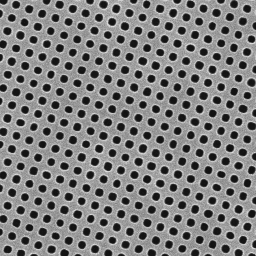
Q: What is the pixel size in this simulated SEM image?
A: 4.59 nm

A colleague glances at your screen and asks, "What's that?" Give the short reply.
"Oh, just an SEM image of a regular array of holes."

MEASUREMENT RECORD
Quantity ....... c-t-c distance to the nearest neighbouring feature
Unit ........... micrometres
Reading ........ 0.0623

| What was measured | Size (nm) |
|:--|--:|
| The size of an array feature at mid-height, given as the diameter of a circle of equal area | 35.9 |